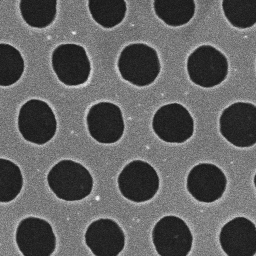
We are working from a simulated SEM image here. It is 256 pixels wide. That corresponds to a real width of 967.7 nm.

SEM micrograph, a regular array of holes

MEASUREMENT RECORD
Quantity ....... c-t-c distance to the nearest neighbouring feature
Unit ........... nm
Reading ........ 253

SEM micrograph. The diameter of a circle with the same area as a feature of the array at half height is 153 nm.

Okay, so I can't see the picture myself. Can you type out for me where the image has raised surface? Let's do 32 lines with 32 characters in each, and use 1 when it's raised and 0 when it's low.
11100001111000001110000011110000
11100001111000001110000011110000
11100001111100011111000011111000
11111111111111111111111111111111
11111111111111111111111111111111
01111111111111111111111111111111
00111110000111100001111100011111
00011100000111100000111000001111
00011110000111100000111000001111
00011110000111100000111100001111
00111111001111111001111110011111
11111111111111111111111111111111
11110111111111111111111111111111
11100011111000011111000111110000
11000001111000011110000011110000
11000001111000011110000011100000
11100001111000011110000011110000
11100011111100011111000111110000
11111111111111111111111111111111
11111111111111111111111111111111
00111110001111110001111110111111
00011100000111100001111100001111
00011100000011100000111000001111
00011100000111100000111100001111
00111110000111110001111100001111
11111111111111111111111111111111
11111111111111111111111111111111
11100111111100111111000111111001
11000011111000011110000011110000
11000001111000011110000011100000
11000001111000001110000011110000
11100001111100011111000011110000